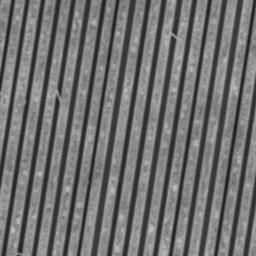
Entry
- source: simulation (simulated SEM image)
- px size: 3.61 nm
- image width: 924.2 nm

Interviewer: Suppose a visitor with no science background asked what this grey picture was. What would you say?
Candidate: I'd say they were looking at parallel lines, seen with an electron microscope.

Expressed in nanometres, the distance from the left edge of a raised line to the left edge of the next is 54.1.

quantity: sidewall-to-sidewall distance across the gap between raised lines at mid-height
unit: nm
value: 18.3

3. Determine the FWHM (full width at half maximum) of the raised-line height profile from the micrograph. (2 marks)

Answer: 0.0366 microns